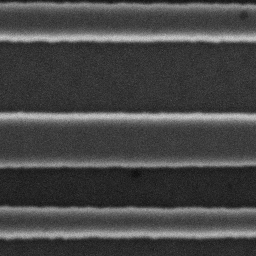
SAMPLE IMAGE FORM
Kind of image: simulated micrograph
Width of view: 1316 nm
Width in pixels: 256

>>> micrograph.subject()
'lines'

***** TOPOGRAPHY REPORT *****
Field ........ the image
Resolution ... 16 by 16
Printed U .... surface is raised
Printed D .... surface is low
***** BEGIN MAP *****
UUUUUUUUUUUUUUUU
UUUUUUUUUUUUUUUU
DDDUDDDDDDDDDUDD
DDDDDDDDDDDDDDDD
DDDDDDDDDDDDDDDD
DDDDDDDDDDDDDDDD
DDDDDDDDDDDDDDDD
UUUUUUUUUUUUUUUU
UUUUUUUUUUUUUUUU
UUUUUUUUUUUUUUUU
DDDDDDDDDDDDDDDD
DDDDDDDDDDDDDDDD
DDDDDDDDDDDDDDDD
UUUUUUUUUUUUUUUU
UUUUUUUUUUUUUUUU
DDDDDDDDDDDDDDDD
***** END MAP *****